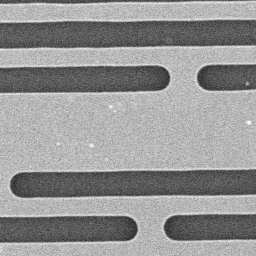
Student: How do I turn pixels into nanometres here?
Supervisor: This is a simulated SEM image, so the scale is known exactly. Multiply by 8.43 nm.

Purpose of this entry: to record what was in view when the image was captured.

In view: groups of lines, slits or small figures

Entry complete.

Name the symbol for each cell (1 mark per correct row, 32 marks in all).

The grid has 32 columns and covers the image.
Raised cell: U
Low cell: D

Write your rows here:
DDDUUUUDDDUUUUUUUUUUUUUUUUUUUUUU
UUUUUUUUUUUUUUUUUUUUUUUUUUUUUUUU
UUUUUUUUUDUUUUUUUUDDDDDDDDDDDDDD
DDDDDDDDDDDDDDDDDDDDDDDDDDDDDDDD
DDDDDDDDDDDDDDDDDDDDDDDDDDDDDDDD
DDDDDDDDDDDDDDDDDDDDDDDDDDDDDDDD
UUUUUUUUUUUUUUUUUUUUUUUUUUUUUUUU
UUUUUUUUUUUUUUUUUUUUUUUUUUUUUUUU
DDDDDDDDDDDDDDDDDDDDDUUUUDDDDDDD
DDDDDDDDDDDDDDDDDDDDDUUUUDDDDDDD
DDDDDDDDDDDDDDDDDDDDDUUUUDDDDDDD
DDDDDDDDDDDDDDDDDDDUUUUUUUUDUUUU
UUUUUUUUUUUUUUUUUUUUUUUUUUUUUUUU
UUUUUUUUUUUUUUUUUUUUUUUUUUUUUUUU
UUUUUUUUUUUUUUUUUUUUUUUUUUUUUUUU
UUUUUUUUUUUUUUUUUUUUUUUUUUUUUUUU
UUUUUUUUUUUUUUUUUUUUUUUUUUUUUUUU
UUUUUUUUUUUUUUUUUUUUUUUUUUUUUUUU
UUUUUUUUUUUUUUUUUUUUUUUUUUUUUUUU
UUUUUUUUUUUUUUUUUUUUUUUUUUUUUUUU
UUUUUUUUUUUUUUUUUUUUUUUUUUUUUUUU
UUUDDDDDDDDDDDDDDDDDDDDDDDDDDDDD
UDDDDDDDDDDDDDDDDDDDDDDDDDDDDDDD
UDDDDDDDDDDDDDDDDDDDDDDDDDDDDDDD
UUDDDDDDDDDDDDDDDDDDDDDDDDDDDUUU
UUUUUUUUUUUUUUUUUUUUUUUUUUUUUUUU
UUUUUUUUUUUUUUUUUUUUUUUUUUUUUUUU
DDDDDDDDDDDDDDDDDUUUUDDDDDDDDDDD
DDDDDDDDDDDDDDDDDUUUDDDDDDDDDDDD
DDDDDDDDDDDDDDDDDUUUUDDDDDDDDDDD
UUUUUUUUUUUUUUUUUUUUUUUUUUUUUUUU
UUUUUUUUUUUUUUUUUUUUUUUUUUUUUUUU